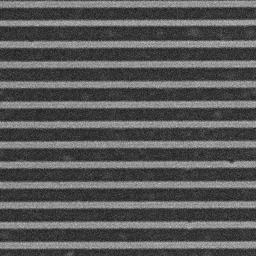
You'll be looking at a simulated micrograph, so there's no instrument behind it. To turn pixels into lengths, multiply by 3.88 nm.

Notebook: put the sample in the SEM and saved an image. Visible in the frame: parallel lines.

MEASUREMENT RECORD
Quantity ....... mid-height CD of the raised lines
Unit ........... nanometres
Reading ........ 23.3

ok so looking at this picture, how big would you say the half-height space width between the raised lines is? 0.0568 um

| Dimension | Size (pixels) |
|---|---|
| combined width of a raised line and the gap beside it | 20.1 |